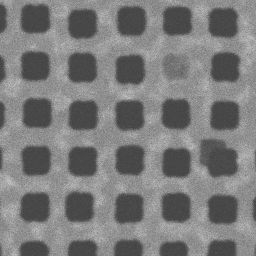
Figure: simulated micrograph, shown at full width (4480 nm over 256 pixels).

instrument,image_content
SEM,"a regular array of holes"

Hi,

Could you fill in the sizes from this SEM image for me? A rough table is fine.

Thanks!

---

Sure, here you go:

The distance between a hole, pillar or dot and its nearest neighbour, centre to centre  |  791 nanometres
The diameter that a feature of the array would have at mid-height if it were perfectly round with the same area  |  566 nanometers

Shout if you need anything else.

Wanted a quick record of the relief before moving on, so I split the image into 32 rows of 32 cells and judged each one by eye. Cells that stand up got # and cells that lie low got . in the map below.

###.#.##########################
.##...###...###...##....##....##
.##...##....###...##....##....##
.##...###...###...##....##....##
#########...####.##########..###
################################
###...##########################
.##...##....##....########....##
.##...###...##....########....##
.##...##....##....########....##
###############..###############
################################
###...##########.####..#########
.##....##...##....##....##....##
.##....##...##....##....##....##
.##...###...##....##....##....##
################################
#########################..#####
###...###...###...###..##....###
###...###...##....##....#.....##
###...###...##....##....#.....##
###...###...###...##....##....##
################################
################################
###...##....###...##....###..###
###...##....##....##....##....##
##....##....##....##....##....##
###...###..###....###..###...###
################################
################################
###...###...##....##...###...###
##....##....##....##....##....##